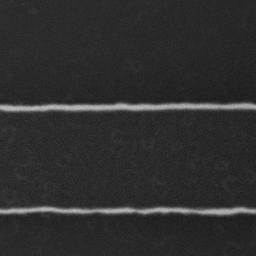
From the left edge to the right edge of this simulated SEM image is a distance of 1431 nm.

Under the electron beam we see one or a few lines or trenches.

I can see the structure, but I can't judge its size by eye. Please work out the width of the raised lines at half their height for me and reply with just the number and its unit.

578 nm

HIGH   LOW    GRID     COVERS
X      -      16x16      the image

----------------
----------------
----------------
----------------
----------------
----------------
----------------
XXXXXXXXXXXXXXXX
XXXXXXXXXXXXXXXX
XXXXXXXXXXXXXXXX
XXXXXXXXXXXXXXXX
XXXXXXXXXXXXXXXX
XXXXXXXXXXXXXXXX
----------------
----------------
----------------